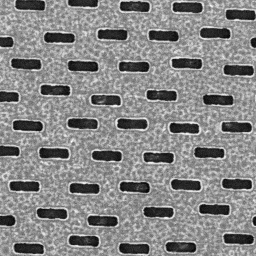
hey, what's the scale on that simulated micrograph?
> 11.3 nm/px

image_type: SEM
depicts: a regular array of holes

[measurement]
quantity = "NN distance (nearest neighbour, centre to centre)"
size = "416 nm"